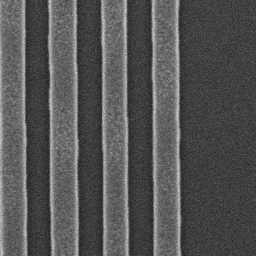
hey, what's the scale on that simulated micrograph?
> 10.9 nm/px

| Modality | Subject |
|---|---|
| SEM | wiring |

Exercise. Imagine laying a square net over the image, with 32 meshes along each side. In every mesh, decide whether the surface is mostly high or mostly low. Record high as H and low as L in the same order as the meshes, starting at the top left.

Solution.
HHHLLLHHHLLLLHHHLLLHHHLLLLLLLLLL
HHHLLLHHHLLLLHHHLLLHHHLLLLLLLLLL
HHHLLLHHHLLLLHHHLLLHHHLLLLLLLLLL
HHHLLLHHHLLLLHHHLLLHHHLLLLLLLLLL
HHHLLLHHHLLLLHHHLLLHHHLLLLLLLLLL
HHHLLLHHHLLLLHHHLLLHHHLLLLLLLLLL
HHHLLLHHHLLLLHHHLLLHHHLLLLLLLLLL
HHHLLLHHHLLLLHHHLLLHHHLLLLLLLLLL
HHHLLLHHHLLLLHHHLLLHHHLLLLLLLLLL
HHHLLLHHHLLLLHHHLLLHHHLLLLLLLLLL
HHHLLLHHHLLLLHHHLLLHHHLLLLLLLLLL
HHHLLLHHHLLLLHHHLLLHHHLLLLLLLLLL
HHHLLLHHHLLLLHHHLLLHHHLLLLLLLLLL
HHHLLLHHHLLLLHHHLLLHHHLLLLLLLLLL
HHHLLLHHHLLLLHHHLLLHHHLLLLLLLLLL
HHHLLLHHHLLLLHHHLLLHHHLLLLLLLLLL
HHHLLLHHHLLLLHHHLLLHHHLLLLLLLLLL
HHHLLLHHHLLLLHHHLLLHHHLLLLLLLLLL
HHHLLLHHHHLLLHHHLLLHHHLLLLLLLLLL
HHHLLLHHHLLLLHHHLLLHHHLLLLLLLLLL
HHHLLLHHHLLLLHHHLLLHHHLLLLLLLLLL
HHHLLLHHHLLLLHHHLLLHHHLLLLLLLLLL
HHHLLLHHHLLLLHHHLLLHHHLLLLLLLLLL
HHHLLLHHHLLLLHHHLLLHHHLLLLLLLLLL
HHHLLLHHHHLLLHHHLLLHHHLLLLLLLLLL
HHHLLLHHHHLLLHHHLLLHHHLLLLLLLLLL
HHHLLLLHHHLLLHHHLLLHHHLLLLLLLLLL
HHHLLLLHHHLLLHHHLLLHHHLLLLLLLLLL
HHHLLLLHHHLLLHHHLLLHHHLLLLLLLLLL
HHHLLLLHHHLLLHHHLLLHHHLLLLLLLLLL
HHHLLLLHHHLLLHHHLLLHHHLLLLLLLLLL
HHHLLLLHHHLLLHHHLLLHHHLLLLLLLLLL